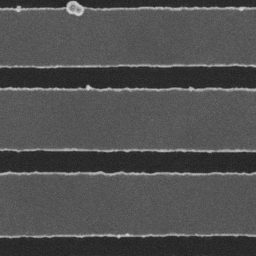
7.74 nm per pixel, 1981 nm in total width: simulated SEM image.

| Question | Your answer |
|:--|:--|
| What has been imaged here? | lines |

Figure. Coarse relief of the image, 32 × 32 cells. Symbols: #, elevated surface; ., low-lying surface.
.........#......................
################################
################################
################################
################################
################################
################################
################################
................................
................................
................................
################################
################################
################################
################################
################################
################################
################################
################################
................................
................................
.#..#.......#...................
################################
################################
################################
################################
################################
################################
################################
#####################.##.##....#
................................
................................